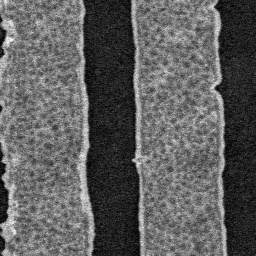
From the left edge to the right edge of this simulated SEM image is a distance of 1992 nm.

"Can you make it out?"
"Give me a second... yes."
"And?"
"one or a few lines or trenches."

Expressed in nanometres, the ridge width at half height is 629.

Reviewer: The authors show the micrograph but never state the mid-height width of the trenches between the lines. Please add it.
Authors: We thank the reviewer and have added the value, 410 nm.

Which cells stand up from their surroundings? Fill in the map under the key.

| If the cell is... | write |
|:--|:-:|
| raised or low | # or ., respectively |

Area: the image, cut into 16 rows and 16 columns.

#####...#####...
#####...######..
#####...######..
#####....#####..
#####....#####..
#####....####...
#####....#####..
#####....#####..
#####....#####..
#####....#####..
#####....#####..
#####....#####..
.####....#####..
.#####...#####..
######...#####..
######...#####..